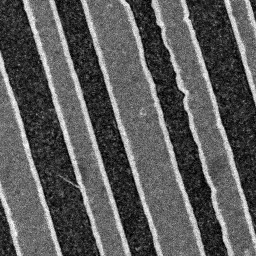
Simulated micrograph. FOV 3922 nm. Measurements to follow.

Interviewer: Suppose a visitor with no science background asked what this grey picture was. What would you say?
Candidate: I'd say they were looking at one or a few lines or trenches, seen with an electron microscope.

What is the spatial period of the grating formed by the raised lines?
974 nm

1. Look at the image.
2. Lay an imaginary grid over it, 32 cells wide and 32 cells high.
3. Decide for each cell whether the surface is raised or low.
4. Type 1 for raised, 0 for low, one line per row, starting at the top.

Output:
00011110000111110001111000001110
00001110000111110000111000000110
00001110000111111000111000000111
00001110000111111000111100000111
00000111000011111000111100000011
00000111000011111000011100000011
00000111000011111100011110000011
00000011100001111100001110000001
00000011100001111100001110000001
10000011100001111110001111000001
10000011110000111110001111000001
10000001110000111110000111000000
11000001110000111110000111100000
11000001111000111111000111100000
11000000111000011111000011100000
11100000111000011111000011100000
11100000111000011111100011110000
11100000111100001111100001110000
11100000011100001111100001111000
11110000011100001111110001111000
11110000011110000111110000111000
11110000001110000111110000111000
11111000001110000111110000111100
11111000001111000111111000011100
11111000000111000011111000011100
01111100000111000011111000011110
01111100000111000011111100011110
01111100000011100001111100001110
00111100000011100001111100001110
00111110000011100001111110001111
00111110000011110000111110001111
00111110000001110000111110000111